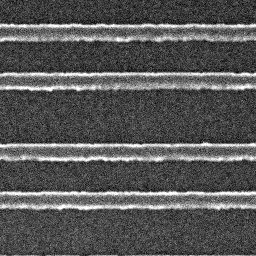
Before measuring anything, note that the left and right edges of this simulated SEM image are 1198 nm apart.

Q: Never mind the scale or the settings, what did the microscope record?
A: lines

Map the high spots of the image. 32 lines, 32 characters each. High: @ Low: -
--------------------------------
--------------------------------
--------------------------------
@@@@@@@@@@@@@@@@@@@@@@@@@@@@@@@@
@@@@@@@@@@@@@@@@@@@@@@@@@@@@@@@@
--------------------------------
--------------------------------
--------------------------------
--------------------------------
@@@@@@@@@@@@@@@@@@@@@@@@@@@@@@@@
@@@@@@@@@@@@@@@@@@@@@@@@@@@@@@@@
--------------------------------
--------------------------------
--------------------------------
--------------------------------
--------------------------------
--------------------------------
--------------------------------
@@@@@@@@@@@@@@@@@@@@@@@@@@@@@@@@
@@@@@@@@@@@@@@@@@@@@@@@@@@@@@@@@
--------------------------------
--------------------------------
--------------------------------
--------------------------------
@@@@@@@@@@@@@@@@@@@@@@@@@@@@@@@@
@@@@@@@@@@@@@@@@@@@@@@@@@@@@@@@@
--------------------------------
--------------------------------
--------------------------------
--------------------------------
--------------------------------
--------------------------------